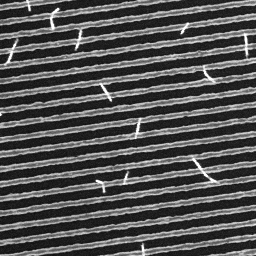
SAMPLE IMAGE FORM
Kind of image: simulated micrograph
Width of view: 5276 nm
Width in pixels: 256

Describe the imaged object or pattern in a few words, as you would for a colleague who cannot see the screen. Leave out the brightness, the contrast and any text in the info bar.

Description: parallel lines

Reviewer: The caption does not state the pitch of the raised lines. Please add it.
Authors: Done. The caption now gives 0.3 um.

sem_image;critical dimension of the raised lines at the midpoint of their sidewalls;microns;0.0791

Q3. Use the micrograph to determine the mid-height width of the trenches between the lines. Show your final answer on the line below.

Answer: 217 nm